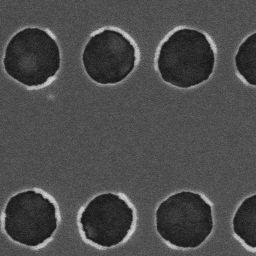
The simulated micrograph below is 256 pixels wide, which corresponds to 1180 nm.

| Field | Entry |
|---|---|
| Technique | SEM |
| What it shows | holes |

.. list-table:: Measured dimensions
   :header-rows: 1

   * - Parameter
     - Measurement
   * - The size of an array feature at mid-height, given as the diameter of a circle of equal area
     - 255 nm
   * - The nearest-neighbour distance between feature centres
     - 355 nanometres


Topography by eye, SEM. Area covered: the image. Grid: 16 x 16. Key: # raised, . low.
################
################
#..###..##...##.
....#...##...##.
...##...##...##.
################
################
################
################
################
################
################
#..###..##...##.
...##...##...##.
...##...##...##.
################